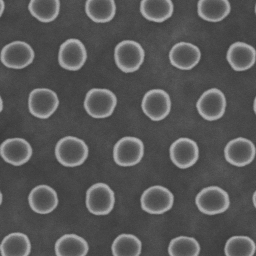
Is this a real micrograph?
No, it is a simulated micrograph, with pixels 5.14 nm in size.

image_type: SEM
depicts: a regular array of raised bodies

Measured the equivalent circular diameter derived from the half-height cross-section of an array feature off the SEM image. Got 143 nm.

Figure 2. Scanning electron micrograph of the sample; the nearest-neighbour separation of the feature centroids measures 0.283 um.